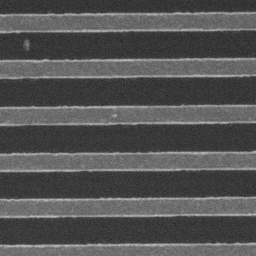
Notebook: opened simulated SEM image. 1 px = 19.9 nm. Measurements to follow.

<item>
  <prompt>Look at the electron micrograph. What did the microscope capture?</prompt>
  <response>lines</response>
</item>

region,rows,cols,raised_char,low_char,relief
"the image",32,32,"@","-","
--------------------------------
--------------------------------
@@@@@@@@@@@@@@@@@@@@@@@@@@@@@@@@
@@@@@@@@@@@@@@@@@@@@@@@@@@@@@@@@
--------------------------------
--------------------------------
--------------------------------
-----@--@--@@@@@@@@@@@@@@@@@@@@@
@@@@@@@@@@@@@@@@@@@@@@@@@@@@@@@@
@@@@@@@@@@@@@@@@@@@@@@@@@@@@@@@-
--------------------------------
--------------------------------
--------------------------------
@@@@@@@@@@@@@@@@@@@@@@@@@@@@@@@@
@@@@@@@@@@@@@@@@@@@@@@@@@@@@@@@@
@@@@@@@@@@@@@@@@@---------------
--------------------------------
--------------------------------
--------------------------------
@@@@@@@@@@@@@@@@@@@@@@@@@@@@@@@@
@@@@@@@@@@@@@@@@@@@@@@@@@@@@@@@@
--------------------------------
--------------------------------
--------------------------------
--------------------------------
@@@@@@@@@@@@@@@@@@@@@@@@@@@@@@@@
@@@@@@@@@@@@@@@@@@@@@@@@@@@@@@@@
--------------------------------
--------------------------------
--------------------------------
-----------------------------@@@
@@@@@@@@@@@@@@@@@@@@@@@@@@@@@@@@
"